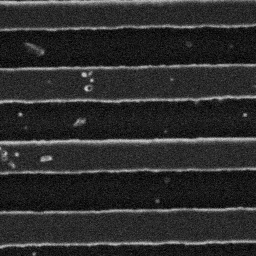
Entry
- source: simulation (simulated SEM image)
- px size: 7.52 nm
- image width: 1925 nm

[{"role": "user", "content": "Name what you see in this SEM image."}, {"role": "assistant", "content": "lines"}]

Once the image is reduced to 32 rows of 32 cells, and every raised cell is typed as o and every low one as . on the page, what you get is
oooooooooooooooooooooooooooooooo
oooooooooooooooooooooooooooooooo
oooooooooooooooooooooooooooooooo
ooooooooooooooo.................
................................
................................
................................
................................
.......ooooooooooooooooooooooooo
oooooooooooooooooooooooooooooooo
oooooooooooooooooooooooooooooooo
oooooooooooooooooooooooooooooooo
ooooooooooooooooooooooooo.......
................................
................................
................................
................................
...................ooooooooooooo
oooooooooooooooooooooooooooooooo
oooooooooooooooooooooooooooooooo
oooooooooooooooooooooooooooooooo
ooooooooooo.....................
................................
................................
................................
................................
oooo.ooooooooooooooooooooooooooo
oooooooooooooooooooooooooooooooo
oooooooooooooooooooooooooooooooo
oooooooooooooooooooooooooooooooo
ooooooooooooooo....o............
................................